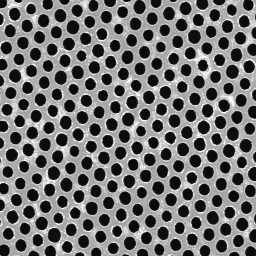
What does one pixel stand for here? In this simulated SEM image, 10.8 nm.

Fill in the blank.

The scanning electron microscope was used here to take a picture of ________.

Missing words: a regular array of holes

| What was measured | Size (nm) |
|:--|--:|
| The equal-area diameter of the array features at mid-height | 128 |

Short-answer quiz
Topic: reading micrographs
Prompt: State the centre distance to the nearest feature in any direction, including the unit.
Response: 183 nm